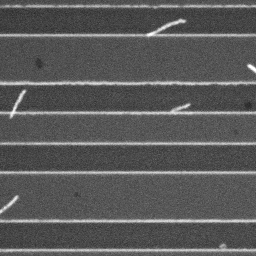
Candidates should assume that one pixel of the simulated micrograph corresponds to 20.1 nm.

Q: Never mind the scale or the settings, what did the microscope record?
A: lines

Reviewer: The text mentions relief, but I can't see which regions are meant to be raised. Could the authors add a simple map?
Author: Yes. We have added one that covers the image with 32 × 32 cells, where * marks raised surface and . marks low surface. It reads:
********************************
................................
................................
................................
********************************
********************************
********************************
********************************
********************************
********************************
********.*****.***....****.**...
................................
................................
................................
********************************
********************************
********************************
********************************
................................
................................
................................
................................
********************************
********************************
********************************
********************************
********************************
********************************
................................
................................
................................
********************************